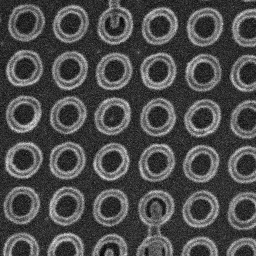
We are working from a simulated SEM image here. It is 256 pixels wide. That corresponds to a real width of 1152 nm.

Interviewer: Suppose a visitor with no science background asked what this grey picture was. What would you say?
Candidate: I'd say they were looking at a regular array of ring-shaped raised bodies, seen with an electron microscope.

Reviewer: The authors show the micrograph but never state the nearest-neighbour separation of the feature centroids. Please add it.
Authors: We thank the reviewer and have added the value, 44.3 px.